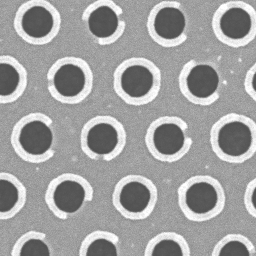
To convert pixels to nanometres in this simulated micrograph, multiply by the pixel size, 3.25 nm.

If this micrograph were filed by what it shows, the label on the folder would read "a regular array of holes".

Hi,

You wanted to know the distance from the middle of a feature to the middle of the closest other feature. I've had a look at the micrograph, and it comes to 215 nm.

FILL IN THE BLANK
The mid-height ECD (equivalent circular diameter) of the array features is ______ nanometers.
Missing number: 102